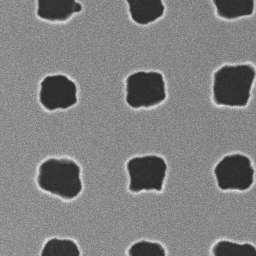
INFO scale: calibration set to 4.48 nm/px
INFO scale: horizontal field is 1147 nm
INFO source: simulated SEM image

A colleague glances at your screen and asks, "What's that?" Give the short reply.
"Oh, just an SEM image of holes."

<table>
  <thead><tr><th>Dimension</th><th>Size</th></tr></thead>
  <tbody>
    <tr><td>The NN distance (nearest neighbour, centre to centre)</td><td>382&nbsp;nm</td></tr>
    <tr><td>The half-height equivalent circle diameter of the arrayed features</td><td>0.171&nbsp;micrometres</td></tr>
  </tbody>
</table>